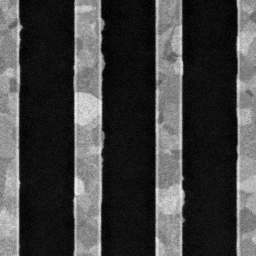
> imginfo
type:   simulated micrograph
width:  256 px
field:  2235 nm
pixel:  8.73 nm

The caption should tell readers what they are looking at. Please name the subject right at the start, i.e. lines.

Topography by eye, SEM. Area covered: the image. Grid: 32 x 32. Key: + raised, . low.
++.......++++.......+++.......++
++.......++++.......+++.......++
++.......++++.......+++.......++
++.......++++.......+++.......++
++.......++++.......+++.......++
++.......++++.......+++.......++
++.......++++.......+++.......++
++.......++++.......+++.......++
++.......++++.......+++.......++
++.......++++.......+++.......++
++.......++++.......+++.......++
++.......++++.......+++.......++
++.......++++.......+++.......++
++.......++++.......+++.......++
++.......++++.......+++.......++
++.......++++.......+++.......++
++.......++++.......+++.......++
++.......++++.......+++.......++
++.......++++.......+++.......++
++.......++++.......+++.......++
++.......++++.......+++.......++
++.......++++.......+++.......++
++.......++++.......+++.......++
++.......++++.......+++.......++
++.......++++.......+++.......++
++.......++++.......+++.......++
++.......++++.......+++.......++
++.......++++.......+++.......++
++.......++++.......+++.......++
++.......++++.......+++.......++
++.......++++.......+++.......++
++.......++++.......+++.......++